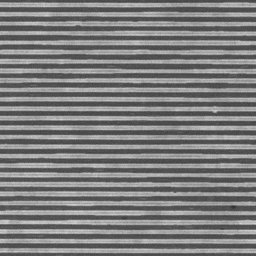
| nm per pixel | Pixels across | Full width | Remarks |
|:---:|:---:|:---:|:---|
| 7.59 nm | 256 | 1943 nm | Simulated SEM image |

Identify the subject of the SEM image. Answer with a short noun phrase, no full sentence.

parallel lines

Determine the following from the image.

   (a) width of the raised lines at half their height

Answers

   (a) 19.9 nm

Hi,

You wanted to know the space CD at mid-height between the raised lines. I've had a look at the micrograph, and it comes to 0.0465 microns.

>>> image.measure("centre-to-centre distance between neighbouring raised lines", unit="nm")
71.7